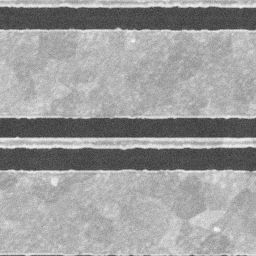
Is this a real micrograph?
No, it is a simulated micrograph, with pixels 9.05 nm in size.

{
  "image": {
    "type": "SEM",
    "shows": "lines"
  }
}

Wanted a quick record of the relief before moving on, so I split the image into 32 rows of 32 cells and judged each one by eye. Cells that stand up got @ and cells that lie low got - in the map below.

@@@@@@@@@@@@@@@@@@@@@@@@@@@@@@@@
--------------------------------
--------------------------------
--------------------------------
@@@@@@@@@@@@@@@@@@@@@@@@@@@@@@@@
@@@@@@@@@@@@@@@@@@@@@@@@@@@@@@@@
@@@@@@@@@@@@@@@@@@@@@@@@@@@@@@@@
@@@@@@@@@@@@@@@@@@@@@@@@@@@@@@@@
@@@@@@@@@@@@@@@@@@@@@@@@@@@@@@@@
@@@@@@@@@@@@@@@@@@@@@@@@@@@@@@@@
@@@@@@@@@@@@@@@@@@@@@@@@@@@@@@@@
@@@@@@@@@@@@@@@@@@@@@@@@@@@@@@@@
@@@@@@@@@@@@@@@@@@@@@@@@@@@@@@@@
@@@@@@@@@@@@@@@@@@@@@@@@@@@@@@@@
@@@@@@@@@@@@@@@@@@@@@@@@@@@@@@@@
--------------------------------
--------------------------------
@@@@@@@@@@@@@@@@@@@@@@@@@@@@@@@@
-@------@---@@@@@-@@@@@-@@@-----
--------------------------------
--------------------------------
@@@@@@@@@@@@@@@@@@@@@@@@@@@@@@@@
@@@@@@@@@@@@@@@@@@@@@@@@@@@@@@@@
@@@@@@@@@@@@@@@@@@@@@@@@@@@@@@@@
@@@@@@@@@@@@@@@@@@@@@@@@@@@@@@@@
@@@@@@@@@@@@@@@@@@@@@@@@@@@@@@@@
@@@@@@@@@@@@@@@@@@@@@@@@@@@@@@@@
@@@@@@@@@@@@@@@@@@@@@@@@@@@@@@@@
@@@@@@@@@@@@@@@@@@@@@@@@@@@@@@@@
@@@@@@@@@@@@@@@@@@@@@@@@@@@@@@@@
@@@@@@@@@@@@@@@@@@@@@@@@@@@@@@@@
@@@@@@@@@@@@@@@@@@@@@@@@@@@@@@@@